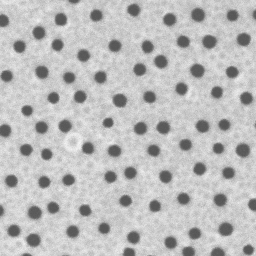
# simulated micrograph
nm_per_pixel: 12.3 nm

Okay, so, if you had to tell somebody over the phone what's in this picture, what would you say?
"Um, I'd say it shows a regular array of holes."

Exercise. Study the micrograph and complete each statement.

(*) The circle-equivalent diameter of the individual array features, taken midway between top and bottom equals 162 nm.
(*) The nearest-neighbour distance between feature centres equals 307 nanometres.